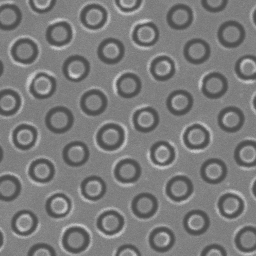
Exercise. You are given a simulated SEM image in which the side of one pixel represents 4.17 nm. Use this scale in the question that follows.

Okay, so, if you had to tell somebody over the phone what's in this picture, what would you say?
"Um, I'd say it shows a regular array of ring-shaped grooves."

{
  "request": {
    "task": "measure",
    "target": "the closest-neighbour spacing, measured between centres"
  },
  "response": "158 nanometers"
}